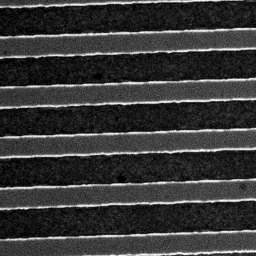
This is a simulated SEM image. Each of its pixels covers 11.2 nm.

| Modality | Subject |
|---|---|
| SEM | lines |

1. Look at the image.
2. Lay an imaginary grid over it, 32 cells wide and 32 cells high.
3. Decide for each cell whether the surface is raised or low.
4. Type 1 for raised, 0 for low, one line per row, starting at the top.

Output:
11111111111111000000000000000000
00000000000000000000000000000000
00000000000000000000000000000000
00000000000000000000000000000000
00001111111111111111111111111111
11111111111111111111111111111111
11111111111111111111010000000000
00000000000000000000000000000000
00000000000000000000000000000000
00000000000000000000000000000000
00000000000001111111111111111111
11111111111111111111111111111111
11111111111111111111111111111000
11000000000000000000000000000000
00000000000000000000000000000000
00000000000000000000000000000000
00000000000000000001111111111111
11111111111111111111111111111111
11111111111111111111111111111111
11111111000000000000000000000000
00000000000000000000000000000000
00000000000000000000000000000000
00000000000000000000000000000111
01111111111111111111111111111111
11111111111111111111111111111111
11111111111111111000000000000000
00000000000000000000000000000000
00000000000000000000000000000000
00000000000000000000000000000000
00000000000011111111111111111111
11111111111111111111111111111111
11111111111111111111111111111000